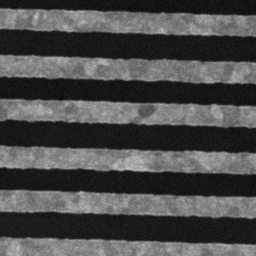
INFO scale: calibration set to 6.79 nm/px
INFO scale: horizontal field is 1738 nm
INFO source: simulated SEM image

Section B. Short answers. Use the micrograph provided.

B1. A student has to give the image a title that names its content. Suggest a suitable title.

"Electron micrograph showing lines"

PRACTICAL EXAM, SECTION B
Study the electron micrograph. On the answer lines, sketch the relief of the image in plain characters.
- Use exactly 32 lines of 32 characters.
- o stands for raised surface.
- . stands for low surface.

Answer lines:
................................
oooooooooooo....................
oooooooooooooooooooooooooooooooo
oooooooooooooooooooooooooooooooo
................................
................................
................................
oooooooooooooo.ooo..o...........
oooooooooooooooooooooooooooooooo
.o.ooooooooooooooooooooooooooooo
................................
................................
................................
oooooooooooooooooooooooooooooooo
oooooooooooooooooooooooooooooooo
..................o.oooooooooooo
................................
................................
ooo.oo..........................
oooooooooooooooooooooooooooooooo
oooooooooooooooooooooooooooooooo
.......................ooooooooo
................................
................................
oooooooooooooooooooooo..........
oooooooooooooooooooooooooooooooo
...o...ooooooooooooooooooooooooo
................................
................................
................................
oooooooooooooooooooooooooooo....
oooooooooooooooooooooooooooooooo